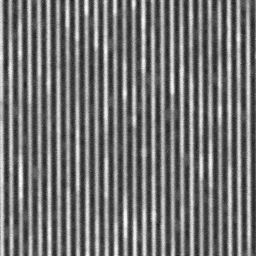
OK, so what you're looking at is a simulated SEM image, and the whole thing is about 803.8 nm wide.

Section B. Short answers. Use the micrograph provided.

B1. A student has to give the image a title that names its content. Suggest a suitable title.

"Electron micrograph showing parallel lines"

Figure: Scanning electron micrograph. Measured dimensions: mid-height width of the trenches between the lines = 21.6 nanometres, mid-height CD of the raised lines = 7.5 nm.